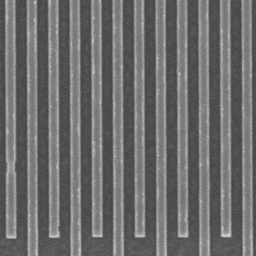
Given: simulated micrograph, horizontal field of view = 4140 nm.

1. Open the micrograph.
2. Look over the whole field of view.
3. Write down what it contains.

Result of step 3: parallel lines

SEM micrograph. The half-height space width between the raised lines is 200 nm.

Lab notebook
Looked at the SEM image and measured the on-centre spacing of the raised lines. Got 21.5 pixels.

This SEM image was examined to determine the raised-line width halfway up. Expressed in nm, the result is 144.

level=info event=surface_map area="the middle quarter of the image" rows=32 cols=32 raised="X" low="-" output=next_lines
--XX---XX---XXX---XX---XX---XXX-
--XX---XX---XXX---XX---XX---XXX-
--XX---XX---XXX---XX---XX---XXX-
--XX---XX---XXX---XX---XX---XXX-
--XX---XX---XXX---XX---XX---XXX-
--XX---XX---XX----XX---XX---XXX-
--XX---XX---XX----XX---XX---XXX-
--XX---XX---XXX---XX---XX---XXX-
--XX---XX---XXX---XX---XX---XXX-
--XX---XX---XXX---XX---XX----XX-
--XX---XX---XX----XX---XX----XX-
--XX---XX---XX----XX---XX----XX-
--XX---XX---XX----XX---XX----XX-
--XX---XX---XXX---XX---XX----XX-
--XX---XX---XXX---XX---XX----XX-
--XX---XX---XXX---XX---XX----XX-
--XX---XX---XX----XX---XX----XX-
--XX---XX---XX----XX---XX----XX-
--XX---XX---XX----XX---XX----XX-
--XX---XX---XX----XX---XX----XX-
--XX---XX---XXX---XX---XX----XX-
--XX---XX---XXX---XX---XX----XX-
--XX---XX---XXX---XX---XX----XX-
--XX---XX----XX---XX---XX----XX-
--XX---XX----XX---XX---XX----XX-
--XX---XX----XX---XX---XX----XX-
--XX---XX----XX---XX---XX----XX-
--XX---XX----XX---XX---XX----XX-
--XX---XX----XX---XX---XX----XX-
--XX---XX----X----XX---XX----XX-
--XX---XX----XX---XX---XX----XX-
--XX---XX----X----XX---XX----XX-